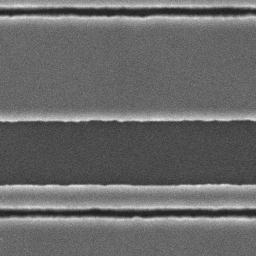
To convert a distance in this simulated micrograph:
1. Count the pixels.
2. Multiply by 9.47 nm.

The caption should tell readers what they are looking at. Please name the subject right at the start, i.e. lines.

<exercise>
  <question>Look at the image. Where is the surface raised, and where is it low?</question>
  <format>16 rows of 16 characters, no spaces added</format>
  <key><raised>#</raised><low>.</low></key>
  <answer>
################
################
################
################
################
################
################
###############.
................
................
................
................
################
################
################
################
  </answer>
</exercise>